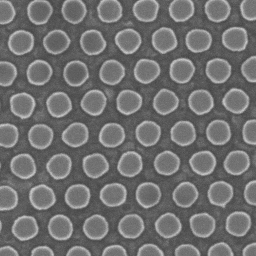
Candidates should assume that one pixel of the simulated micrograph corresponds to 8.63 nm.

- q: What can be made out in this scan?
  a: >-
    a regular array of raised bodies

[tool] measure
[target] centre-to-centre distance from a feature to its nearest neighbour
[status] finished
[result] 300 nm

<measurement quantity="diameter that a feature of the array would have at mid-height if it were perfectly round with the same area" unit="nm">210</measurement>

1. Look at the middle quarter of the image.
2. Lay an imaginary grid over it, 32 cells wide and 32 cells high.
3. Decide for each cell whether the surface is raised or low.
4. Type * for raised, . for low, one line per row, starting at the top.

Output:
.****.....*****...******...*****
******...******...******...*****
******...******...******...*****
******...*****....*****....****.
.****.....****.....***.......*..
................................
........................**......
......****....****.....*****....
*....*****...******....*****...*
**..******...******....******..*
**..******...******....*****...*
**...*****....****.....****.....
*......**...............*.......
................................
....................**..........
.****.....****.....****.....****
******...******...******...*****
******...******...******...*****
******...******...******...*****
*****....*****.....****.....****
..**......***...................
................................
...............***......***.....
*....*****....*****....******...
**...******...*****....******...
*....******...*****....******...
*....******...*****....*****....
*.....****....****......*.......
.......*........................
................................
..***......****....****......***
.*****...******...******....****